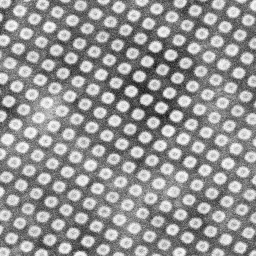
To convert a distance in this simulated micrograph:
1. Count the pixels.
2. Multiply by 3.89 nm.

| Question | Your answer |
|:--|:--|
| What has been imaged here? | a regular array of raised bodies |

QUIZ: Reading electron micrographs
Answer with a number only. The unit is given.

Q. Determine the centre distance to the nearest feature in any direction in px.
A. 16.9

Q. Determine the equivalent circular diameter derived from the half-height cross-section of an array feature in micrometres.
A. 0.0408